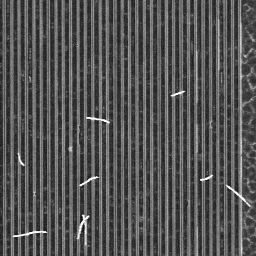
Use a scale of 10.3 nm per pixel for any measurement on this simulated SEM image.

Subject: parallel lines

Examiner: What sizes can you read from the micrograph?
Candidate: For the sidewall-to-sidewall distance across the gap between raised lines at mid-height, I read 4.75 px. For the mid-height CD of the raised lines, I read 0.0245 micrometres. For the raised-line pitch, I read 7.36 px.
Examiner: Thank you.